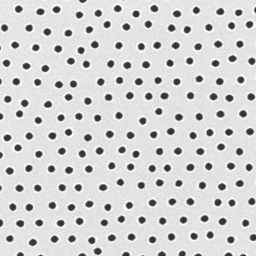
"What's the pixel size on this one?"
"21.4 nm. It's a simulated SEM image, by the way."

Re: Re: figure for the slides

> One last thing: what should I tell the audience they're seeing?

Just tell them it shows a regular array of holes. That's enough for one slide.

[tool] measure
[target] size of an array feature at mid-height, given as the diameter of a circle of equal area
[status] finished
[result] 165 nm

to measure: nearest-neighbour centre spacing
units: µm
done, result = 0.366